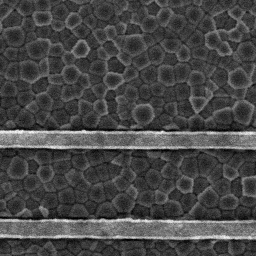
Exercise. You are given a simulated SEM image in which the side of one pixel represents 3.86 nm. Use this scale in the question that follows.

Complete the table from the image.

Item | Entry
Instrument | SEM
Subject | one or a few lines or trenches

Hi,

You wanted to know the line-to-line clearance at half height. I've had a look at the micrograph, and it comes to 0.276 um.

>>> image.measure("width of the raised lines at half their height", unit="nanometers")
68.9